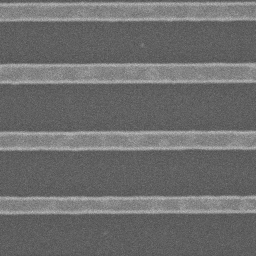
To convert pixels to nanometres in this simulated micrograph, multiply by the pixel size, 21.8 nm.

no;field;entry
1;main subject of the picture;one or a few lines or trenches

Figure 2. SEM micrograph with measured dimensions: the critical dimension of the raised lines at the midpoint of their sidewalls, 0.352 µm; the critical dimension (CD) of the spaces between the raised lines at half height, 1070 nanometers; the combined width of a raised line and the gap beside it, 1.41 um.